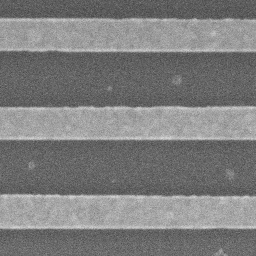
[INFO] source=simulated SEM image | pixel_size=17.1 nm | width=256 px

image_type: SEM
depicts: lines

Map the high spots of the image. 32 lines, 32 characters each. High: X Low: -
--------------------------------
--------------------------------
XXXXXXXXXXXXXXXXXXXXXXX-X---XXX-
XXXXXXXXXXXXXXXXXXXXXXXXXXXXXXXX
XXXXXXXXXXXXXXXXXXXXXXXXXXXXXXXX
XXXXXXXXXXXXXXXXXXXXXXXXXXXXXXXX
--------------------------------
--------------------------------
--------------------------------
--------------------------------
--------------------------------
--------------------------------
--------------------------------
----------XX-XXXX--XXXX--XXXXXXX
XXXXXXXXXXXXXXXXXXXXXXXXXXXXXXXX
XXXXXXXXXXXXXXXXXXXXXXXXXXXXXXXX
XXXXXXXXXXXXXXXXXXXXXXXXXXXXXXXX
--------------------------------
--------------------------------
--------------------------------
--------------------------------
--------------------------------
--------------------------------
--------------------------------
XXXXXXXX------------------------
XXXXXXXXXXXXXXXXXXXXXXXXXXXXXXXX
XXXXXXXXXXXXXXXXXXXXXXXXXXXXXXXX
XXXXXXXXXXXXXXXXXXXXXXXXXXXXXXXX
--------------------------------
--------------------------------
--------------------------------
--------------------------------